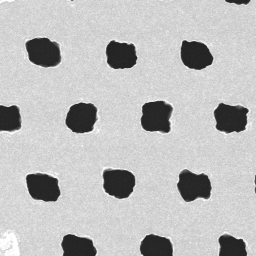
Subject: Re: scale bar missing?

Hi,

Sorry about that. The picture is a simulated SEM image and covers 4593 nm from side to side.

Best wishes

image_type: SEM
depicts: a regular array of holes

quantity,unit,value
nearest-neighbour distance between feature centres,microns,1.34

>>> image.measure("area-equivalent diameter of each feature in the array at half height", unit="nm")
562